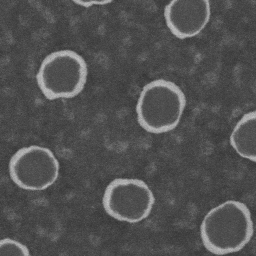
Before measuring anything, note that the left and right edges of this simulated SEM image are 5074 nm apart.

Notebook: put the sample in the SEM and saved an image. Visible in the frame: raised bodies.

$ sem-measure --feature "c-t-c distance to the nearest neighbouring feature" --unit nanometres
1960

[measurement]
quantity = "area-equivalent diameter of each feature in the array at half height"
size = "896 nm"